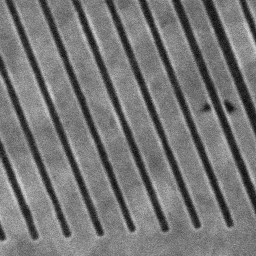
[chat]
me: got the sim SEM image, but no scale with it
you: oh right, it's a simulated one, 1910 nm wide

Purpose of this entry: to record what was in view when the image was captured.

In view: parallel lines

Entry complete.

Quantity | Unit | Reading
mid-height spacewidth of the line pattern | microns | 0.0634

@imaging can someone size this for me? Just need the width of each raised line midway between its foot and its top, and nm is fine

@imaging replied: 170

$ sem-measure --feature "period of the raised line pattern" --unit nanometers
231